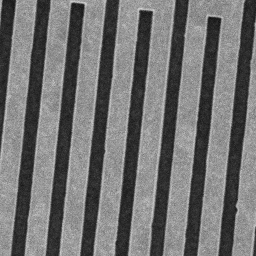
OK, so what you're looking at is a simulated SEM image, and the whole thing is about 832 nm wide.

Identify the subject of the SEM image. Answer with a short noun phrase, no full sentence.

parallel lines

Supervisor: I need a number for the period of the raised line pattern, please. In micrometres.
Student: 0.111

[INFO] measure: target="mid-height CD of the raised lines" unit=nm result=65.4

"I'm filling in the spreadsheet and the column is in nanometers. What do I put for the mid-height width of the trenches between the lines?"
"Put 47.4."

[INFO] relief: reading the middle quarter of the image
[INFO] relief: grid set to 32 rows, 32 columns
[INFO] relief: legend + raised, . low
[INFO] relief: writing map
....+++++....++++....+++++....++
....+++++...+++++....+++++....++
....++++....+++++....+++++....++
...+++++....+++++....+++++...+++
...+++++....+++++....++++....+++
...+++++....+++++....++++....+++
...+++++....+++++....++++....+++
...+++++....+++++....++++....+++
...+++++....+++++...+++++....+++
...+++++....++++....+++++....+++
...+++++...+++++....+++++....+++
...+++++...+++++....+++++....+++
...++++....+++++....+++++....+++
..+++++....+++++....+++++...++++
..+++++....+++++....++++....++++
..+++++....+++++...+++++....++++
..+++++....+++++...+++++....++++
..+++++....+++++...+++++....++++
..+++++....+++++...+++++....++++
..+++++....++++....+++++....++++
..+++++...+++++....+++++....++++
..+++++...+++++....+++++....++++
..++++....+++++....+++++...+++++
.+++++....+++++....+++++...+++++
.+++++....+++++....++++....+++++
.+++++....+++++....++++....+++++
.+++++....+++++....++++....+++++
.+++++....+++++...+++++....+++++
.+++++....+++++...+++++....+++++
.+++++....++++....+++++....+++++
.+++++...+++++....+++++....+++++
.++++....+++++....+++++....++++.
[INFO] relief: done